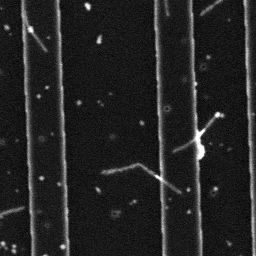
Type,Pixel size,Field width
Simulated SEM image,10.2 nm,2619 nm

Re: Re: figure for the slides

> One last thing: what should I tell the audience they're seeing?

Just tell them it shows lines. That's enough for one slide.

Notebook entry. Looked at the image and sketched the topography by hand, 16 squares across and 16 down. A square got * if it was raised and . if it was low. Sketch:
.***......**...*
.***......**...*
.***......**...*
..**......**...*
..**......**...*
..**......**...*
..**......**....
..**......**....
..**......**....
..**......***...
..**......**....
..**......**....
..**......**....
..**......***...
..**......***...
..**......***...